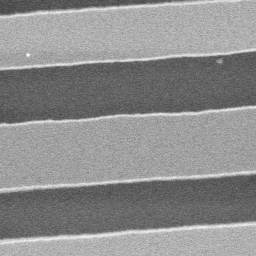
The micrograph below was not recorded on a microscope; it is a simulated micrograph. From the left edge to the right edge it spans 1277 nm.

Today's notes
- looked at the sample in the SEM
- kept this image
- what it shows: lines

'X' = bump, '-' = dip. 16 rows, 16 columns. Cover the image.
-------XXXXXXXXX
XXXXXXXXXXXXXXXX
XXXXXXXXXXXXXXXX
XXXXXXXXXXX-----
----------------
----------------
----------------
-----XXXXXXXXXXX
XXXXXXXXXXXXXXXX
XXXXXXXXXXXXXXXX
XXXXXXXXXXXXXXXX
XXXXX-----------
----------------
----------------
---------XXXXXXX
XXXXXXXXXXXXXXXX